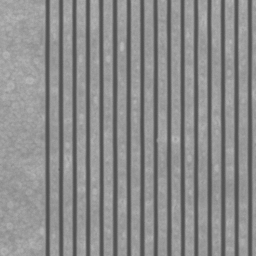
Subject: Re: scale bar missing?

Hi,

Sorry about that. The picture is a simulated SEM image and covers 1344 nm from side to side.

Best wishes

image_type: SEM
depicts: parallel lines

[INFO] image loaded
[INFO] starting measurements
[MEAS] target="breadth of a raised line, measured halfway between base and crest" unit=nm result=51.2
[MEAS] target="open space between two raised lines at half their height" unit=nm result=19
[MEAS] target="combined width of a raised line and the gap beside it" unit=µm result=0.0709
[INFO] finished